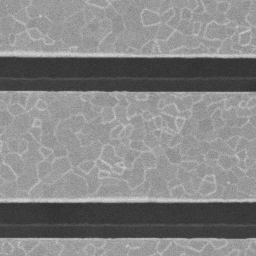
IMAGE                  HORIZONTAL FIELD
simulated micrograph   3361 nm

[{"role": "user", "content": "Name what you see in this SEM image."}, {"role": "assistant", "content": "lines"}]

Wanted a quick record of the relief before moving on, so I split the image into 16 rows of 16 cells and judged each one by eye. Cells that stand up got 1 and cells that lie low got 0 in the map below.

1111111111111111
1111111111111111
1111111111111111
1111111111111111
0000000000000000
0000000000000000
1111111111111111
1111111111111111
1111111111111111
1111111111111111
1111111111111111
1111111111111111
1111111111111111
0000000000000000
0000000000000000
1111111111111111